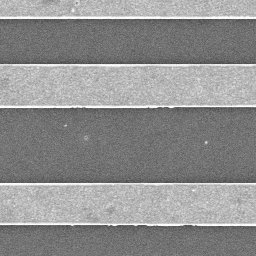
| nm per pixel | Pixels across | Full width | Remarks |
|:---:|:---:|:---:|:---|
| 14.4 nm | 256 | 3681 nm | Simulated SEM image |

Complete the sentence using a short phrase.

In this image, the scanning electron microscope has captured lines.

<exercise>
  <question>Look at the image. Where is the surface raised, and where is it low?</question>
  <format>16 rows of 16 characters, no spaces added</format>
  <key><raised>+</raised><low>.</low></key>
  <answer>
++++++++++++++++
................
................
................
++++++++++++++++
++++++++++++++++
++++++++++++++++
................
................
................
................
++++++++++++++++
++++++++++++++++
++++++++++++++++
................
................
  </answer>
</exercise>